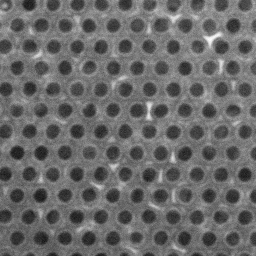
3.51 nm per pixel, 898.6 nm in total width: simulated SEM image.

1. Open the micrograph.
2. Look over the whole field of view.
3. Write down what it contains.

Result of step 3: a regular array of raised bodies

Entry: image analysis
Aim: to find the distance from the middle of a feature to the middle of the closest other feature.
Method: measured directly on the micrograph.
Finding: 83.2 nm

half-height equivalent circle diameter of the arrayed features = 0.0604 um